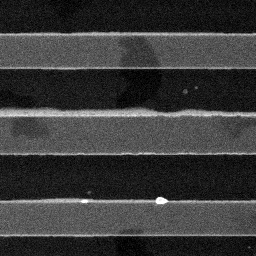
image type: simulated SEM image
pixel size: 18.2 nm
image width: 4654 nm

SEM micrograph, lines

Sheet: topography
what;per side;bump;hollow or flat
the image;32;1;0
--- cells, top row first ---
00000000000000000000000000000000
00000000000000000000000000000000
00000000000000000000000000000000
00000000000000000000000000000000
11111111111111111111111111111111
11111111111111111111111111111111
11111111111111111111111111111111
11111111111111111111111111111111
11111111111111111111111111111111
00000000000000000000000000000000
00000000000000000000000000000000
00000000000000000000000000000000
00000000000000000000000000000000
00000000000000000000000000000000
11111111111111111111111111111111
11111111111111111111111111111111
11111111111111111111111111111111
11111111111111111111111111111111
11111111111111111111111111111111
00000000000000000000000000000000
00000000000000000000000000000000
00000000000000000000000000000000
00000000000000000000000000000000
00000000000000000000000000000000
00000000000000000000000000000000
11111111111111111111111111111111
11111111111111111111111111111111
11111111111111111111111111111111
11111111111111111111111111111111
00000000000000000000000000000000
00000000000000000000000000000000
00000000000000000000000000000000